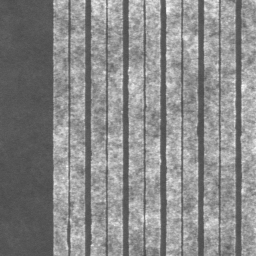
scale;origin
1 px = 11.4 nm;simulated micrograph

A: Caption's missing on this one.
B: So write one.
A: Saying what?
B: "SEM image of parallel lines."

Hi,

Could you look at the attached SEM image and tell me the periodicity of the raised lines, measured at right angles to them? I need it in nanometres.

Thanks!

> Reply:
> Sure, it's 212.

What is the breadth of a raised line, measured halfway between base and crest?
162 nm